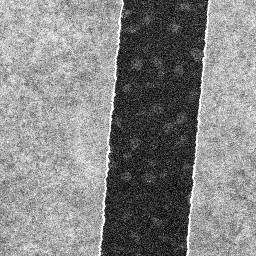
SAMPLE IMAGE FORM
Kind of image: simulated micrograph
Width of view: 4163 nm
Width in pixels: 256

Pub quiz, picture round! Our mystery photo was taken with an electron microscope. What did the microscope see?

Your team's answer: one or a few lines or trenches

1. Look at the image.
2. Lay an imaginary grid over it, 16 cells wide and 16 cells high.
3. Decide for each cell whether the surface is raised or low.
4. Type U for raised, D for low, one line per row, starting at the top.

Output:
DDDDDDDDUUUUUDDD
DDDDDDDUUUUUUDDD
DDDDDDDUUUUUUDDD
DDDDDDDUUUUUUDDD
DDDDDDDUUUUUUDDD
DDDDDDDUUUUUUDDD
DDDDDDDUUUUUDDDD
DDDDDDDUUUUUDDDD
DDDDDDDUUUUUDDDD
DDDDDDDUUUUUDDDD
DDDDDDDUUUUUDDDD
DDDDDDDUUUUUDDDD
DDDDDDDUUUUUDDDD
DDDDDDUUUUUUDDDD
DDDDDDUUUUUUDDDD
DDDDDDUUUUUUDDDD